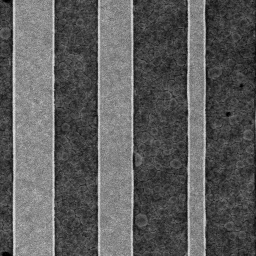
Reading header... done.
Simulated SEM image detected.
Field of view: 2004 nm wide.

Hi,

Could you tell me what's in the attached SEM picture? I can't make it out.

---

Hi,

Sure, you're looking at one or a few lines or trenches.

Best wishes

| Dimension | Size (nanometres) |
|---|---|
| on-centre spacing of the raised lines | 637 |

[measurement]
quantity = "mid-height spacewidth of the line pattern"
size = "355 nm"